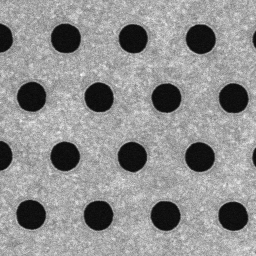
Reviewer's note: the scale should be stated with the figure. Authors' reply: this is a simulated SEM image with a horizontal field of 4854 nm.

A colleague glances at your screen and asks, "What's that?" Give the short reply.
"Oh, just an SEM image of a regular array of holes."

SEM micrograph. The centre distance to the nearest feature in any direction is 1280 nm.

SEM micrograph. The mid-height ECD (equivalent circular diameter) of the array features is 572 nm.